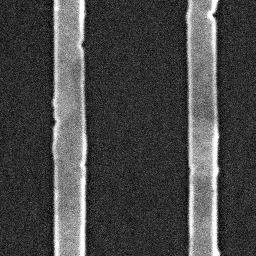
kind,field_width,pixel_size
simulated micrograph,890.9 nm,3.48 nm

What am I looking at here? one or a few lines or trenches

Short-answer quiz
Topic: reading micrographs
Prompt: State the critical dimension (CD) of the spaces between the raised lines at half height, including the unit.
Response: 367 nanometres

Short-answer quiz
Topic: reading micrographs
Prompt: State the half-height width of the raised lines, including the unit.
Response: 27.8 pixels